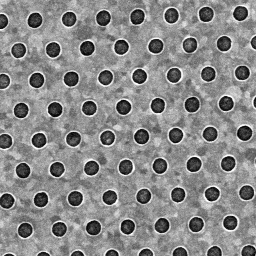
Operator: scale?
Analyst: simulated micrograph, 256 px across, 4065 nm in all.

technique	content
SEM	a regular array of holes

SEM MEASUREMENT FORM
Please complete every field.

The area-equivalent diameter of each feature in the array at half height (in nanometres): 248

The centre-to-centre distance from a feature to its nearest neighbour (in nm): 541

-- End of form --